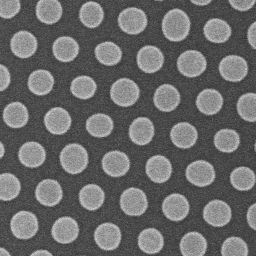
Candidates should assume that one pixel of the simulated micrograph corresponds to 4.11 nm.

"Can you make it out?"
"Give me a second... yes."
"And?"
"a regular array of raised bodies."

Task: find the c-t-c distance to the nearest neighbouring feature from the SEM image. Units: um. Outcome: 0.17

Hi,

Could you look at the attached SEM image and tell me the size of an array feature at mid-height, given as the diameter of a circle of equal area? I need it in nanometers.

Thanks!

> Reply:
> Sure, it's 107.